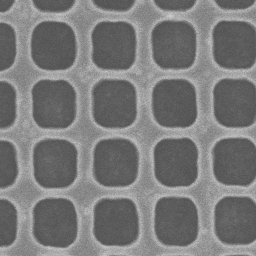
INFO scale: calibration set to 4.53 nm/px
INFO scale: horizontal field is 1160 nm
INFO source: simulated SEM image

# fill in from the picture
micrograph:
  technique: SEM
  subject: a regular array of holes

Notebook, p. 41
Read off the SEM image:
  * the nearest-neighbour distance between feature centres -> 0.267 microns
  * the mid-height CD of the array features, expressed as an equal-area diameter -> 225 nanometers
